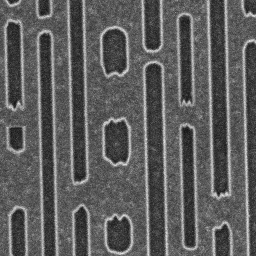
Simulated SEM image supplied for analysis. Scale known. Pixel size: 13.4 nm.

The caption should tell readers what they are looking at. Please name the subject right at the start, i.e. parallel lines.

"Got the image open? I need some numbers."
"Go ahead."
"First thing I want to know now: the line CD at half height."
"228 nanometers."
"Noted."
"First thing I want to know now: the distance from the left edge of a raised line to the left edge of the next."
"459 nm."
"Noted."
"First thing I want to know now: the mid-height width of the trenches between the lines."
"206 nanometres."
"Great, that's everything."